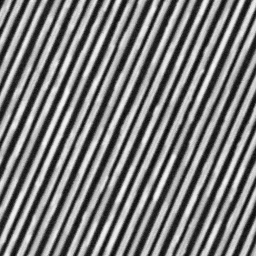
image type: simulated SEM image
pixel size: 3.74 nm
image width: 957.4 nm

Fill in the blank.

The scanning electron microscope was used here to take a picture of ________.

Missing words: parallel lines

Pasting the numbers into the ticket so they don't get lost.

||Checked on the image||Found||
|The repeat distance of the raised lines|42.3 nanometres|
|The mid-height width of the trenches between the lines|20.5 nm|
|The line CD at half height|20.5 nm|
